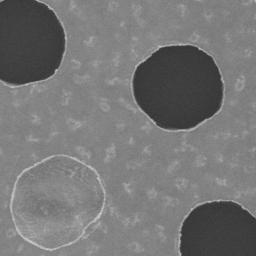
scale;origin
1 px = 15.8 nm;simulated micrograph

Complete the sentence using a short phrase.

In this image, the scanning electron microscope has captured holes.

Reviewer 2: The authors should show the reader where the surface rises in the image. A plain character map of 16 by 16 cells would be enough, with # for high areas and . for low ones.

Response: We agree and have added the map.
...#############
....############
....############
....#####....###
...#####......##
########......##
#########.....##
##########...###
################
################
################
################
##.#############
############....
###########.....
###########.....